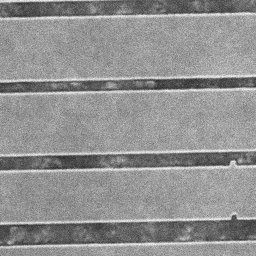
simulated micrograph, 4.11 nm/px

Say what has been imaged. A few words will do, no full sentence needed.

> one or a few lines or trenches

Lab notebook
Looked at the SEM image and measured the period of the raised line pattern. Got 303 nanometers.